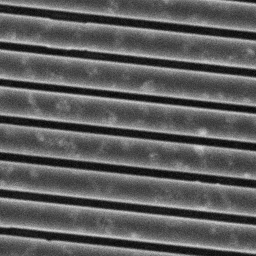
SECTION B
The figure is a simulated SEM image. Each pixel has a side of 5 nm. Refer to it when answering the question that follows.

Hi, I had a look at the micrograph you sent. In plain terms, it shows parallel lines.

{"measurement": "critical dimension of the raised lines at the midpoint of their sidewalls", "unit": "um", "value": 0.137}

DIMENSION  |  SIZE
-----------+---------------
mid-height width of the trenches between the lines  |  44.1 nanometers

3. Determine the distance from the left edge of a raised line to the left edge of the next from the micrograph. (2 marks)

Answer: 183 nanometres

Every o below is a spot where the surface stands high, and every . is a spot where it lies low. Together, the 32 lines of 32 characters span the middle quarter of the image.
oooooooooooooooooooo............
ooooooooooooooooooooooooooooo...
oooooooooooooooooooooooooooooooo
oooooooooooooooooooooooooooooooo
oooooooooooooooooooooooooooooooo
...ooooooooooooooooooooooooooooo
............oooooooooooooooooooo
.....................ooooooooooo
oooooooo......................oo
ooooooooooooooooo...............
ooooooooooooooooooooooooooo.....
oooooooooooooooooooooooooooooooo
oooooooooooooooooooooooooooooooo
oooooooooooooooooooooooooooooooo
..oooooooooooooooooooooooooooooo
...........ooooooooooooooooooooo
....................oooooooooooo
oooooo........................oo
ooooooooooooooooo...............
oooooooooooooooooooooooooo......
oooooooooooooooooooooooooooooooo
oooooooooooooooooooooooooooooooo
oooooooooooooooooooooooooooooooo
oooooooooooooooooooooooooooooooo
........oooooooooooooooooooooooo
..................oooooooooooooo
ooooo......................ooooo
oooooooooooooo..................
ooooooooooooooooooooooo.........
oooooooooooooooooooooooooooooooo
oooooooooooooooooooooooooooooooo
oooooooooooooooooooooooooooooooo